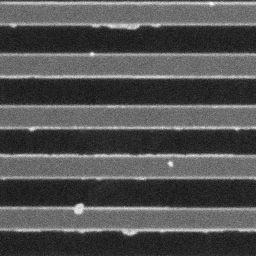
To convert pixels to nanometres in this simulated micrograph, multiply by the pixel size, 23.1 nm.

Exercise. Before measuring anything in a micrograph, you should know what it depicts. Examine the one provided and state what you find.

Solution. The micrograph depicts lines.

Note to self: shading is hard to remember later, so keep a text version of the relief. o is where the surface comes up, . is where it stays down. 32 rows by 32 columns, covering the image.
oooooooooooooooooooooooooooooooo
oooooooooooooooooooooooooooooooo
oooooooooooooooooooooooooooooooo
................................
................................
................................
................................
oooooooooooooooooooooooooooooooo
oooooooooooooooooooooooooooooooo
oooooooooooooooooooooooooooooooo
................................
................................
................................
oooooooooooooooooooooooooooooooo
oooooooooooooooooooooooooooooooo
oooooooooooooooooooooooooooooooo
................................
................................
................................
o.oooo.ooo.ooooo.oooooooooooo...
oooooooooooooooooooooooooooooooo
oooooooooooooooooooooooooooooooo
................................
................................
................................
................................
oooooooooooooooooooooooooooooooo
oooooooooooooooooooooooooooooooo
oooooooooooooooooooooooooooooooo
................................
................................
................................